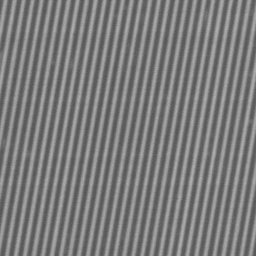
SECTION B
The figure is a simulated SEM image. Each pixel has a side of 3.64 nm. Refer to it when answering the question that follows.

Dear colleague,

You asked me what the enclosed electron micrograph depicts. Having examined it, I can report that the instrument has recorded parallel lines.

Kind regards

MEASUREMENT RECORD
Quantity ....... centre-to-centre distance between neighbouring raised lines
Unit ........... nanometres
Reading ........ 32.4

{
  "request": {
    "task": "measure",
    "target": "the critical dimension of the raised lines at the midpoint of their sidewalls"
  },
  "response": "13 nm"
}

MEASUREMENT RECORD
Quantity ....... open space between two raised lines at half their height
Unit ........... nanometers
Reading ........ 19.3